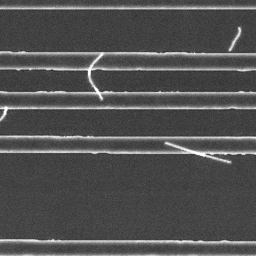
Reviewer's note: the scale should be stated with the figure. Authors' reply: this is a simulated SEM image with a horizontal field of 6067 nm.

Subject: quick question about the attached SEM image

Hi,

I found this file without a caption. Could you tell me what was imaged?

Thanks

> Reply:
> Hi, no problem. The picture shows lines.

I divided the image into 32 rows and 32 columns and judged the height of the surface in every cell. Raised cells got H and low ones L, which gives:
HHHHHHHHHHHHHHHHHHHHHHHHHHHHHHHH
LLLLLLLLLLLLLLLLLLLLLLLLLLLLLLLL
LLLLLLLLLLLLLLLLLLLLLLLLLLLLLLLL
LLLLLLLLLLLLLLLLLLLLLLLLLLLLLLLL
LLLLLLLLLLLLLLLLLLLLLLLLLLLLLLLL
LLLLLLLLLLLLLLLLLLLLLLLLLLLLLLLL
LLLLLLLLLLLLLLLLLLLLLLLLLLLLLLLL
HHHHHHHHHHHHHHHHHHHHHHHHHHHHHHHH
HHHHHHHHHHHHHHHHHHHHHHHHHHHHHHHH
LLLLLLLLLLLLLLLLLLLLLLLLLLLLLLLL
LLLLLLLLLLLLLLLLLLLLLLLLLLLLLLLL
HLLLHHHHLLLLHHHLLLLHHLHLLLLLLLLL
HHHHHHHHHHHHHHHHHHHHHHHHHHHHHHHH
HHHHHHHHHHHHHHHHHHHHHHHHHHHHHHHH
LLLLLLLLLLLLLLLLLLLLLLLLLLLLLLLL
LLLLLLLLLLLLLLLLLLLLLLLLLLLLLLLL
LLLLLLLLLLLLLLLLLLLLLLLLLLLLLLLL
HHHHHHHHHHHHHHHHHHHHHHHHHHHHHHHH
HHHHHHHHHHHHHHHHHHHHHHHHHHHHHHHH
LLLLLLLLLLLLLLLLLLLLLLLLLLLLLLLL
LLLLLLLLLLLLLLLLLLLLLLLLLLLLLLLL
LLLLLLLLLLLLLLLLLLLLLLLLLLLLLLLL
LLLLLLLLLLLLLLLLLLLLLLLLLLLLLLLL
LLLLLLLLLLLLLLLLLLLLLLLLLLLLLLLL
LLLLLLLLLLLLLLLLLLLLLLLLLLLLLLLL
LLLLLLLLLLLLLLLLLLLLLLLLLLLLLLLL
LLLLLLLLLLLLLLLLLLLLLLLLLLLLLLLL
LLLLLLLLLLLLLLLLLLLLLLLLLLLLLLLL
LLLLLLLLLLLLLLLLLLLLLLLLLLLLLLLL
LLLLLLLLLLLLLLLLLLLLLLLLLLLLLLLL
HHHHHHHHHHHHHHHHHHHHHHHHHHHHHHHH
HHHHHHHHHHHHHHHHHHHHHHHHHHHHHHHH